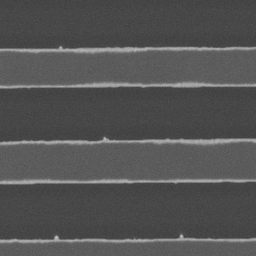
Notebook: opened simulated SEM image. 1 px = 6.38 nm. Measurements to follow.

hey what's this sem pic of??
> lines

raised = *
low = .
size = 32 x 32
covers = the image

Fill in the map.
................................
................................
................................
................................
................................
................................
********************************
********************************
********************************
********************************
********************************
................................
................................
................................
................................
................................
................................
...........................*****
********************************
********************************
********************************
********************************
********************************
................................
................................
................................
................................
................................
................................
................................
********************************
********************************